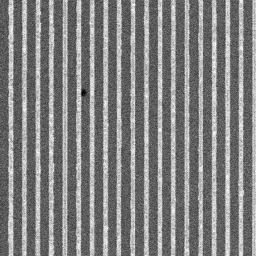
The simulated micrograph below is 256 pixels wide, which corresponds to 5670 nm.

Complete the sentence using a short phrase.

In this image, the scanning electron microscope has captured parallel lines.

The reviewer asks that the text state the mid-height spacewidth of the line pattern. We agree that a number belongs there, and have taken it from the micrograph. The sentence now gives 0.216 um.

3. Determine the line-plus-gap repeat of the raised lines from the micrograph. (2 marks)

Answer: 300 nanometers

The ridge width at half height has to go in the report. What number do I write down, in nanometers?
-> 83.1